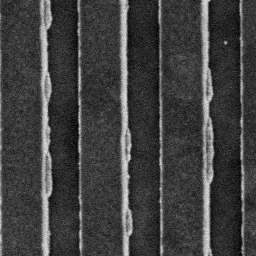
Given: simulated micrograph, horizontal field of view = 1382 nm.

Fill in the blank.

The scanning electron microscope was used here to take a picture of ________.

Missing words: lines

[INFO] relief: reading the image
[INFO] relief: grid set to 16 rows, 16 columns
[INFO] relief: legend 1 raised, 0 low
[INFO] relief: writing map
1110011100111001
1110011100111001
1110011100111001
1110011100111001
1110011100111001
1110011100111001
1110011100111001
1110011100111001
1110011100111001
1110011100111001
1110011100111001
1110011100111001
1110011100111001
1110011100111001
1110011100111001
1110011100111001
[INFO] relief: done